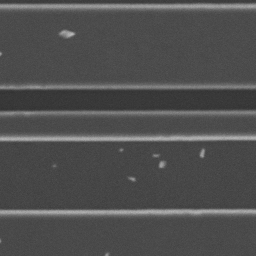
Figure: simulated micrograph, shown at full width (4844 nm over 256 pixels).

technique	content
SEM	lines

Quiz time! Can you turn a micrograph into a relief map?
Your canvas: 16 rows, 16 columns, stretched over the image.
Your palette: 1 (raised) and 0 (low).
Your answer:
1111111111111111
1111111111111111
1111111111111111
1111111111111111
1111111111111111
0000000000000000
0000000000000000
1111111111111111
1111111111111111
0000000000000000
0000000000000000
0000000000000000
0000000000000000
1111111111111111
1111111111111111
1111111111111111